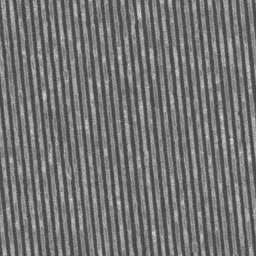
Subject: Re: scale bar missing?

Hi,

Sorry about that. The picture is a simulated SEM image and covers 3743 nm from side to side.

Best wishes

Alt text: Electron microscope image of parallel lines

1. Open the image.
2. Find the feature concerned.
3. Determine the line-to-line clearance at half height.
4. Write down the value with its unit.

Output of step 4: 72.7 nm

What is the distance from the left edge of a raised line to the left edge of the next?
116 nanometres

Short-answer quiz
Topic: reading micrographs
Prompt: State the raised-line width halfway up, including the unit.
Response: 49.1 nm